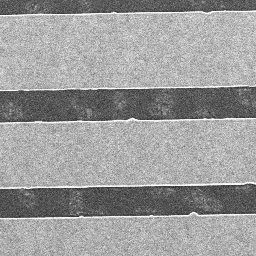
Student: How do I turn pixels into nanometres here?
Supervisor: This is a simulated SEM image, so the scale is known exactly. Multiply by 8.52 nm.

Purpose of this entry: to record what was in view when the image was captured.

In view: one or a few lines or trenches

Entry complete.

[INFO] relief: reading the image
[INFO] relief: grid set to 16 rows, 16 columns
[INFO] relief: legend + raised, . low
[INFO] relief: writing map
................
++++++++++++++++
++++++++++++++++
++++++++++++++++
++++++++++++++++
++++++++........
................
........+..+++++
++++++++++++++++
++++++++++++++++
++++++++++++++++
++++++++++++++..
................
...........+++++
++++++++++++++++
++++++++++++++++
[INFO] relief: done